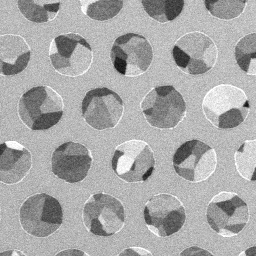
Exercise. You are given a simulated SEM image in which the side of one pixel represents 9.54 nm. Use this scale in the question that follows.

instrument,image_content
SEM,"a regular array of raised bodies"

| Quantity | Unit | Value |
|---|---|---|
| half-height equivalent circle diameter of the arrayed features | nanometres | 408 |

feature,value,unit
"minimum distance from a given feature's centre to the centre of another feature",586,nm